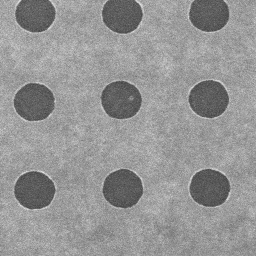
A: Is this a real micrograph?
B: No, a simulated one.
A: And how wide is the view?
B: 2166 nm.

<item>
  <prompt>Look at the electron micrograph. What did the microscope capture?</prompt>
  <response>holes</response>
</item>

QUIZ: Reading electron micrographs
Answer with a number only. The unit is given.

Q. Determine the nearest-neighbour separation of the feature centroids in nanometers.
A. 736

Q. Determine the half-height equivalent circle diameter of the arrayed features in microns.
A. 0.34